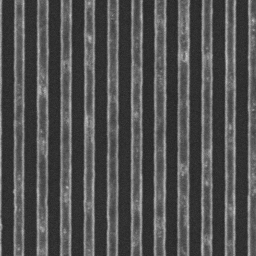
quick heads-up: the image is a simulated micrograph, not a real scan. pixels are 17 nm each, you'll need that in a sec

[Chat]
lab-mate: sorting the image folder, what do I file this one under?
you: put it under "parallel lines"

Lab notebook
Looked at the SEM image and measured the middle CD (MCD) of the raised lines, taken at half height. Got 168 nanometres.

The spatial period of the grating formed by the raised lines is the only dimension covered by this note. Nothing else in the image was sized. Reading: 23.5 pixels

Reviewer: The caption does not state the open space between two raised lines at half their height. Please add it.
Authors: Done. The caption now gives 236 nanometers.